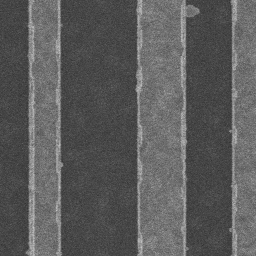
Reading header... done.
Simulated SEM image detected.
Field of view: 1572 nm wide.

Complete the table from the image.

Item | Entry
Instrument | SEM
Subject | one or a few lines or trenches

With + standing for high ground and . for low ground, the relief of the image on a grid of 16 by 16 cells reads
..++.....+++...+
..++.....+++...+
..++.....+++...+
..++.....+++...+
..++.....+++...+
..++.....+++...+
..++.....+++...+
..++.....+++...+
..++.....+++...+
..++.....+++...+
..++.....++....+
..++.....+++...+
..++.....+++...+
..++.....+++...+
..++.....+++...+
..++.....+++...+